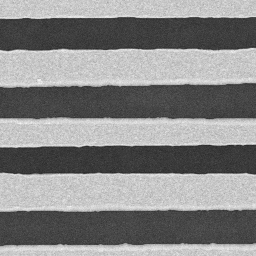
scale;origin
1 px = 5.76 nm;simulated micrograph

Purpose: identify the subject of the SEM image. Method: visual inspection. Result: lines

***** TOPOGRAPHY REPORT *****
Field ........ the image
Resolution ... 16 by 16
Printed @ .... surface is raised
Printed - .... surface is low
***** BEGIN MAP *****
@@@@@@@@@@@@@@@@
----------------
----------------
@@@@@@@@@@@@@@@@
@@@@@@@@@@@@@@@@
----------------
----------------
@@@@@@@@@@@@@@@@
@@@@@@@@@@@@@@@@
----------------
----------------
@@@@@@@@@@@@@@@@
@@@@@@@@@@@@@@@@
----------------
----------------
@@@@@@@@@@@@@@@@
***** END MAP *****